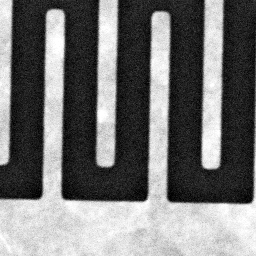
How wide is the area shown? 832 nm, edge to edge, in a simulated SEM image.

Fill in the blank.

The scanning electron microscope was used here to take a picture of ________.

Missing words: groups of lines, slits or small figures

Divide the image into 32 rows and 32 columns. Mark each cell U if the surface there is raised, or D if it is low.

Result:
UDDDDDDDDDDDUUUDDDDDDDDDDDUUDDDD
UDDDDDUUDDDDUUUDDDDDUDDDDDUUDDDD
UDDDDDUUDDDDUUUDDDDUUDDDDDUUDDDD
UDDDDDUUDDDDUUUDDDDUUDDDDDUUDDDD
UDDDDDUUDDDDUUUDDDDUUDDDDDUUDDDD
UDDDDDUUDDDDUUUDDDDUUDDDDDUUDDDD
UDDDDDUUDDDDUUUDDDDUUDDDDDUUDDDD
UDDDDDUUDDDDUUDDDDDUUDDDDDUUDDDD
UDDDDDUUDDDDUUDDDDDUUDDDDDUUDDDD
UDDDDDUUDDDDUUDDDDDUUDDDDDUUDDDD
UDDDDDUUDDDDUUDDDDDUUDDDDDUUDDDD
UDDDDDUUDDDDUUDDDDDUUDDDDDUUDDDD
UDDDDDUUDDDDUUDDDDDUUDDDDDUUDDDD
UDDDDDUUDDDDUUDDDDDUUDDDDUUUDDDD
UDDDDDUUDDDDUUDDDDDUUDDDDUUDDDDD
UDDDDDUUDDDDUUDDDDDUUDDDDUUDDDDD
UDDDDDUUDDDDUUDDDDDUUDDDDUUDDDDD
UDDDDDUUDDDDUUDDDDDUUDDDDUUDDDDD
UDDDDDUUDDDDUUDDDDDUUDDDDUUDDDDD
UDDDDUUUDDDDUUDDDDDUUDDDDUUDDDDD
UDDDDUUUDDDDUUDDDDDUUDDDDUUDDDDD
DDDDDUUUDDDDDDDDDDDUUDDDDDDDDDDD
DDDDDUUUDDDDDDDDDDDUUDDDDDDDDDDD
DDDDDUUUDDDDDDDDDDDUUDDDDDDDDDDD
DDDDDUUUDDDDDDDDDDDUUDDDDDDDDDDD
UUUUUUUUUUUUUUUUUUUUUUUUDDDDDDDU
UUUUUUUUUUUUUUUUUUUUUUUUUUUUUUUU
UUUUUUUUUUUUUUUUUUUUUUUUUUUUUUUU
UUUUUUUUUUUUUUUUUUUUUUUUUUUUUUUU
UUUUUUUUUUUUUUUUUUUUUUUUUUUUUUUU
UUUUUUUUUUUUUUUUUUUUUUUUUUUUUUUU
UUUUUUUUUUUUUUUUUUUUUUUUUUUUUUUU